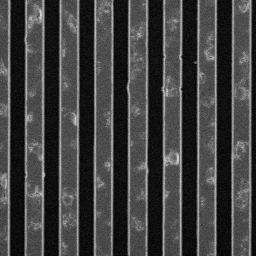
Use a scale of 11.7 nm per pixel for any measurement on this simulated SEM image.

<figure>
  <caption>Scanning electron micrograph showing parallel lines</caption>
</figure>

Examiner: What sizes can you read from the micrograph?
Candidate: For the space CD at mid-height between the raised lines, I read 0.182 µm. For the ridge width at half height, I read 213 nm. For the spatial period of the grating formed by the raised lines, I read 403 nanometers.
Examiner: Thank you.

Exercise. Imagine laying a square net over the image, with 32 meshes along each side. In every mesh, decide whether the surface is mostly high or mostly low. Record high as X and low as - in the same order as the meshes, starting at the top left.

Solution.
X--XX---XX--XX--XX--XXX--XX--XX-
X--XXX--XX--XX--XX--XXX--XX--XX-
X--XX---XX--XX--XX--XXX--XX--XX-
X--XXX-XXX--XX--XX--XXX--XX--XX-
X--XX--XXX--XX--XX--XXX--XX--XX-
X--XX---XX--XX--XX--XXX--XX--XX-
X--XX---XX--XX--XX--XXX--XX--XX-
X--XX---XX--XX--XX--XXX--XX--XX-
X--XX---XX--XX--XX--XXX--XX--XX-
X--XX---XX--XX--XX--XXX--XX--XX-
X--XX---XX--XX--XX--XXX--XX--XX-
X--XX---XX--XX--XX--XXX--XX--XX-
X--XX---XX--XX--XX--XXX--XX--XX-
X--XX---XX--XX--XX--XXX--XX--XX-
X--XX---XX--XX--XX--XXX--XX--XX-
X--XX---XX--XX--XX--XXX--XX--XX-
X--XX---XX--XX--XX--XXX--XX--XX-
X--XX--XXX--XX--XX--XXX--XX--XX-
X--XX--XXX--XX--XX--XXX--XX--XX-
X--XX--XXX--XX--XX--XXX--XX--XX-
X--XX--XXX--XX--XX--XXX--XX--XX-
X--XX--XXX--XX--XX--XXX--XX--XX-
X--XX--XXX--XX--XX--XXX--XX--XX-
X--XX--XXX--XX--XX--XXX--XX--XX-
X--XX--XXX--XX--XX--XXX--XX--XX-
X--XX--XXX--XX--XX--XXX--XX--XX-
X--XX--XXX--XX--XX--XXX--XX--XX-
X--XX--XXX--XX--XX--XXX--XX--XX-
X--XX--XXX--XX--XX--XXX--XX--XX-
X--XX--XXX--XX--XX--XXX--XX--XX-
X--XX---XX--XX--XX--XXX--XX--XX-
X--XX---XX--XX--XX--XXX--XX--XX-